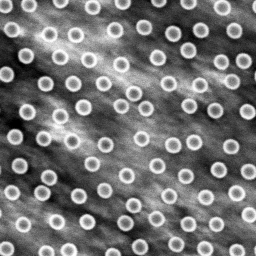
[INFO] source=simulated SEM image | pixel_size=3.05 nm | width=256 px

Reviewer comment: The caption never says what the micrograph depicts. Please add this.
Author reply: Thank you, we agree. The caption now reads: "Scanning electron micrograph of a regular array of raised bodies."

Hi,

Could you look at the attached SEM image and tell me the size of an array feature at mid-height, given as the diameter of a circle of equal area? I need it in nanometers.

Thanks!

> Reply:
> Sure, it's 44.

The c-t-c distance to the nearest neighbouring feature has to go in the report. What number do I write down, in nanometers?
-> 79.8